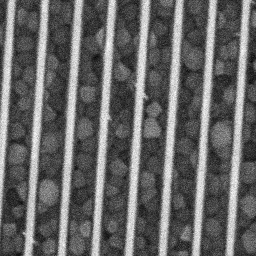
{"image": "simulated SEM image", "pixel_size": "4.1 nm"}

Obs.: parallel lines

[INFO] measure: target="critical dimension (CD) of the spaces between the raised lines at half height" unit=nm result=109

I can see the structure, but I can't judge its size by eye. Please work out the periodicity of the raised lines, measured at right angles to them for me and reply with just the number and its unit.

137 nm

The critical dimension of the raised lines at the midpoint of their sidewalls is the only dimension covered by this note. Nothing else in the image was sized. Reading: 26.6 nm